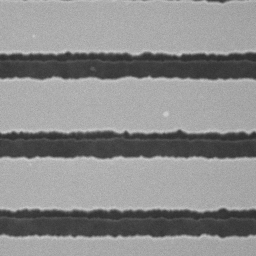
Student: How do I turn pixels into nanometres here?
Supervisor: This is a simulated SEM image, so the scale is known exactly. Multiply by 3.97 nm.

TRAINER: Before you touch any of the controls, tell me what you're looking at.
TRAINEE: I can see lines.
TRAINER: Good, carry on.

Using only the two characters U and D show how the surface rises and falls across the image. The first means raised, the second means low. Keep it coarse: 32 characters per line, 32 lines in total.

UUUUUUUUUUUUUUUUUUUUUUUUUUUUUUUU
UUUUUUUUUUUUUUUUUUUUUUUUUUUUUUUU
UUUUUUUUUUUUUUUUUUUUUUUUUUUUUUUU
UUUUUUUUUUUUUUUUUUUUUUUUUUUUUUUU
UUUUUUUUUUUUUUUUUUUUUUUUUUUUUUUU
UUUUUUUUUUUUUUUUUUUUUUUUUUUUUUUU
UUUUUUUUUUUUUUUUUUUUUUUUUUUUUUUU
DDDDDDDDDDDDDDDDDDDDDDDDDDDDDDDD
DDDDDDDDDDDDDDDDDDDDDDDDDDDDDDDD
DDDDDDDDDDDDDDDDDDDDDDDDDDDDDDDD
UUUUUUUUUUUUUUUUUUUUUUUUUUUUUUUU
UUUUUUUUUUUUUUUUUUUUUUUUUUUUUUUU
UUUUUUUUUUUUUUUUUUUUUUUUUUUUUUUU
UUUUUUUUUUUUUUUUUUUUUUUUUUUUUUUU
UUUUUUUUUUUUUUUUUUUUUUUUUUUUUUUU
UUUUUUUUUUUUUUUUUUUUUUUUUUUUUUUU
UDUUUDDUUDUDDDUDUUUUUUDUUUUUUUUU
DDDDDDDDDDDDDDDDDDDDDDDDDDDDDDDD
DDDDDDDDDDDDDDDDDDDDDDDDDDDDDDDD
DDDDDDDDDDDDDDDDDDDDDDDDDDDDDDDD
UUUUUUUUUUUUUUUUUUUUUUUUUUUUUUUU
UUUUUUUUUUUUUUUUUUUUUUUUUUUUUUUU
UUUUUUUUUUUUUUUUUUUUUUUUUUUUUUUU
UUUUUUUUUUUUUUUUUUUUUUUUUUUUUUUU
UUUUUUUUUUUUUUUUUUUUUUUUUUUUUUUU
UUUUUUUUUUUUUUUUUUUUUUUUUUUUUUUU
DDDDDDDDDDDDDDDDDDDDDDDDDDDDDDDD
DDDDDDDDDDDDDDDDDDDDDDDDDDDDDDDD
DDDDDDDDDDDDDDDDDDDDDDDDDDDDDDDD
UDDUUUUDUDUDDUDDDUUDDUUUDUUDDDDU
UUUUUUUUUUUUUUUUUUUUUUUUUUUUUUUU
UUUUUUUUUUUUUUUUUUUUUUUUUUUUUUUU